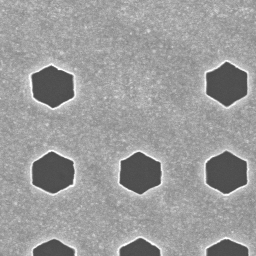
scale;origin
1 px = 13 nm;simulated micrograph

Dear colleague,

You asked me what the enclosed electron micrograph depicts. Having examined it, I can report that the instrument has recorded holes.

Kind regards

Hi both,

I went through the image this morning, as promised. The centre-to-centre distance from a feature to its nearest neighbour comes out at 1120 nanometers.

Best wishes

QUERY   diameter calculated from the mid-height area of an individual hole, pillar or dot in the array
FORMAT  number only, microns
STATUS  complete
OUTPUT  0.541